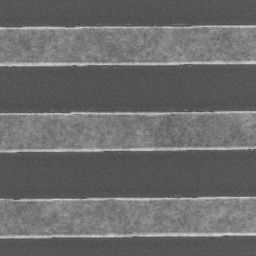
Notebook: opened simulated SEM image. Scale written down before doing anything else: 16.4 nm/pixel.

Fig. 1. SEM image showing lines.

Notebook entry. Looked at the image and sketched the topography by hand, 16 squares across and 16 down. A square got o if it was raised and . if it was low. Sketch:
................
................
oooooooooooooooo
oooooooooooooooo
................
................
................
oooooooooooooooo
oooooooooooooooo
................
................
................
...ooooooooooooo
oooooooooooooooo
oooooooooooooooo
................